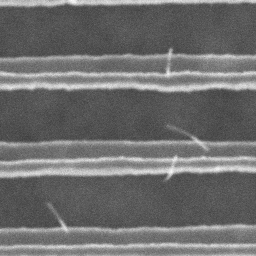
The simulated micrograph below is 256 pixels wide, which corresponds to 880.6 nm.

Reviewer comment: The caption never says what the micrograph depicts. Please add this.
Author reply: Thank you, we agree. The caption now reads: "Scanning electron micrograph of lines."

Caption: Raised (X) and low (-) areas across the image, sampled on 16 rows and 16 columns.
----------------
----------------
----------------
----XXXXXXXXXXXX
XXXXXXXXXXXXXXXX
XX-XX---XXXXX-XX
----------------
----------------
----------------
XXXXXXXXXXXXXXXX
XXXXXXXXXXXXXXXX
----------------
----------------
----------------
XXXXXXXXXXXXXXXX
XXXXXXXXXXXXXXXX